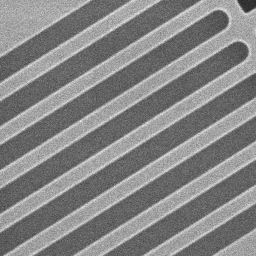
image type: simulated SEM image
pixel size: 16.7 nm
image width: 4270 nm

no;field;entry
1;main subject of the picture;groups of lines, slits or small figures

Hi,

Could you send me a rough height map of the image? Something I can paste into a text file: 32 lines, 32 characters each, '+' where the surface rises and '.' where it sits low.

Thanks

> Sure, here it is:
+++++++++++.....+++......+++++..
+++++++++.....++++.....+++..++++
+++++++......+++.....++++....+++
++++++.....++++.....+++.....++++
++++.....++++.....++++.....+++++
+++.....+++......+++.....++++..+
+.....++++.....+++......+++....+
.....+++.....++++.....++++.....+
...++++.....+++.....++++.....+++
.++++.....++++.....+++......+++.
+++......+++.....++++.....++++..
++.....+++......+++.....++++....
.....++++.....++++.....+++......
....+++.....++++.....++++.....++
..++++.....+++......+++.....++++
.+++.....++++.....++++.....+++..
+++.....+++.....++++.....++++...
+.....++++.....+++......+++.....
.....+++.....++++.....+++......+
...+++......+++.....++++.....+++
.++++.....++++.....+++.....++++.
+++.....++++.....++++.....+++...
++.....+++......+++.....++++....
.....++++.....+++......+++.....+
....+++.....++++.....++++.....++
..++++.....+++......+++.....++++
++++.....++++.....+++......+++..
++......+++.....++++.....++++...
+.....++++.....+++.....++++.....
....++++.....++++.....+++......+
...+++......+++.....++++.....+++
.++++.....+++......+++.....+++++